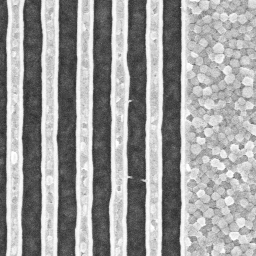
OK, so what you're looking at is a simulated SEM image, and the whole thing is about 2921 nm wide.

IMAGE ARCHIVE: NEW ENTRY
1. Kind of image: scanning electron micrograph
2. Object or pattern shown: parallel lines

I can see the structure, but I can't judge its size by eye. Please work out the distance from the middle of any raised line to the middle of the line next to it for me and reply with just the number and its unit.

398 nm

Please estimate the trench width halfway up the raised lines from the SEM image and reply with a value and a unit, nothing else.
241 nm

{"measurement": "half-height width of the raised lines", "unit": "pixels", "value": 14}